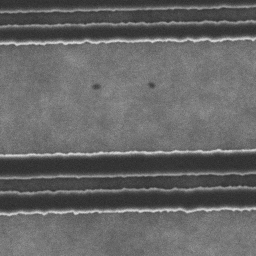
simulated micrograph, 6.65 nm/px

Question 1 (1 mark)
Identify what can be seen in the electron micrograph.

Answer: lines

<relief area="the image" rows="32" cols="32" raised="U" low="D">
UUUUUUUUUUUUUUUUUUUUUUUUUUUUUUUU
UUUUDDDDDDDDDDDDDDDDDDDDDDDDDDDD
DDDDDDDDDDDDDDDDDDDDDDDDDDDDDDDD
UUUUUUUUUUUUUUUUUUUUUUUUUUUUUUUU
UUUUUUUUUUUUUUUUUUUUUUUUUUUUUUUU
UUUUUUDDDDDDDDDDDDDDDDDDDDDDDDDD
DDDDDDDDDDDDDDDDDDDDDDDDDDDDDDDD
DDDDDDDDDDDDDDDDDDDDDDDDDDDDDDDD
DDDDDDDDDDDDDDDDDDDDDDDDDDDDDDDD
DDDDDDDDDDDDDDDDDDDDDDDDDDDDDDDD
DDDDDDDDDDDDDDDDDDDDDDDDDDDDDDDD
DDDDDDDDDDDDDDDDDDDDDDDDDDDDDDDD
DDDDDDDDDDDDDDDDDDDDDDDDDDDDDDDD
DDDDDDDDDDDDDDDDDDDDDDDDDDDDDDDD
DDDDDDDDDDDDDDDDDDDDDDDDDDDDDDDD
DDDDDDDDDDDDDDDDDDDDDDDDDDDDDDDD
DDDDDDDDDDDDDDDDDDDDDDDDDDDDDDDD
DDDDDDDDDDDDDDDDDDDDDDDDDDDDDDDD
DDDDDDDDDDDDDDDDDDDDDDDDDDDDDDDD
UUUUUUUUUUUUUUUUUUUUUUUUUUUUUUUU
UUUUUUUUUUUUUUUUUUUUUUUUUUUUUUUU
UUUUUUUUUUUUUUUUUUUUUUUUUUUUUUUU
DDDDDDDDDDDDDDDDDDDDDDDDDDDDDDDD
DDDDDDDDDDDDDDDDDDDDDDDDDUUUUUUU
UUUUUUUUUUUUUUUUUUUUUUUUUUUUUUUU
UUUUUUUUUUUUUUUUUUUUUUUUUUUUUUUU
UUUUUUUUUUUDDDDDDDDDDDDDDDDDDDDD
DDDDDDDDDDDDDDDDDDDDDDDDDDDDDDDD
DDDDDDDDDDDDDDDDDDDDDDDDDDDDDDDD
DDDDDDDDDDDDDDDDDDDDDDDDDDDDDDDD
DDDDDDDDDDDDDDDDDDDDDDDDDDDDDDDD
DDDDDDDDDDDDDDDDDDDDDDDDDDDDDDDD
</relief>